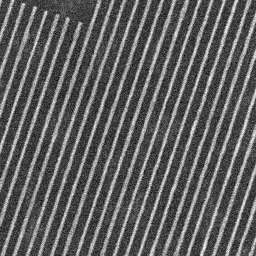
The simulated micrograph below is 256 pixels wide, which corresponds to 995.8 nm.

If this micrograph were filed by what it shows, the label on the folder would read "parallel lines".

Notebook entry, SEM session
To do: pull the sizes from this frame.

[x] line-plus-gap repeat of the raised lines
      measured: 45.9 nm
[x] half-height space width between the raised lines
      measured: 0.0345 micrometres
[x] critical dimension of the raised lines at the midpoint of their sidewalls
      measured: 10.1 nm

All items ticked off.